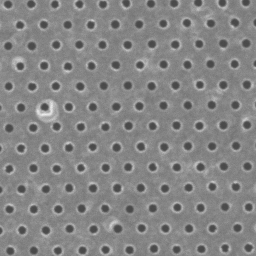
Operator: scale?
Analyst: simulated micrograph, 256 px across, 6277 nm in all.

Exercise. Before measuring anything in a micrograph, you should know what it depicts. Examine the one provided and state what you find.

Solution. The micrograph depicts a regular array of holes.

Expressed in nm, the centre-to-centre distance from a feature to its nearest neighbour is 565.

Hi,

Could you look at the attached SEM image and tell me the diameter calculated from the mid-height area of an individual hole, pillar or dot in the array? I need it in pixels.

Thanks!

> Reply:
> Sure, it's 8.74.